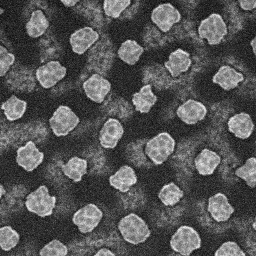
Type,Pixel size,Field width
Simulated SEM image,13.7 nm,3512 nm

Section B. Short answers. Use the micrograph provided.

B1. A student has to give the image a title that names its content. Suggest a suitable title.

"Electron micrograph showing a regular array of raised bodies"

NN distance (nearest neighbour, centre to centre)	651	nanometres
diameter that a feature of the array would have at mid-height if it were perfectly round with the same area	333	nm